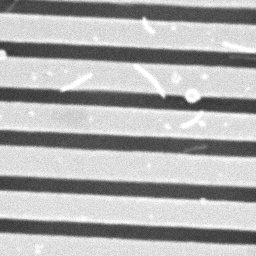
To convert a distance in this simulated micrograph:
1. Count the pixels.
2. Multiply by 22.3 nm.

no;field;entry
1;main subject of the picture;lines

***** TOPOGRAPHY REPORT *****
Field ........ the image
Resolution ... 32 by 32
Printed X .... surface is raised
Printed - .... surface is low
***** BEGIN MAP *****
--------------X----XXXXXXXXXXXXX
--------------------------------
XXXXXXXXXXXXXXXXXXX-------------
XXXXXXXXXXXXXXXXXXXXXXXXXXXXXXXX
XXXXXXXXXXXXXXXXXXXXXXXXXXXXXXXX
---------XXXXXXXXXXXXXXXXXXXXXXX
------------------------------XX
XXXXXXXXXX----------------------
XXXXXXXXXXXXXXXXXXXXXXXXXXXXX---
XXXXXXXXXXXXXXXXXXXXXXXXXXXXXXXX
XXXXXXXXXXXXXXXXXXXXXXXXXXXXXXXX
-----------------XXXXXXXXXXXXXXX
-----------------------XX-------
XXXXXXXXXXXXXXX-----------------
XXXXXXXXXXXXXXXXXXXXXXXXXXXXXXXX
XXXXXXXXXXXXXXXXXXXXXXXXXXXXXXXX
-------XXXXXXXXXXXXXXXXXXXXXXXXX
-----------------------------XXX
XXXXXX--------------------------
XXXXXXXXXXXXXXXXXXXXXXXXXXX-----
XXXXXXXXXXXXXXXXXXXXXXXXXXXXXXXX
XXXXXXXXXXXXXXXXXXXXXXXXXXXXXXXX
-------------XXXXXXXXXXXXXXXXXXX
--------------------------------
XXXXXXXXXXXX--------------------
XXXXXXXXXXXXXXXXXXXXXXXXXXXXXXXX
XXXXXXXXXXXXXXXXXXXXXXXXXXXXXXXX
-----XXXXXXXXXXXXXXXXXXXXXXXXXXX
-------------------------XXXXXXX
XXXXXX--------------------------
XXXXXXXXXXXXXXXXXXXXXXXXXXX-----
XXXXXXXXXXXXXXXXXXXXXXXXXXXXXXXX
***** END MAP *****